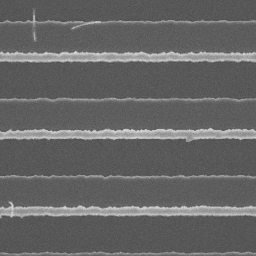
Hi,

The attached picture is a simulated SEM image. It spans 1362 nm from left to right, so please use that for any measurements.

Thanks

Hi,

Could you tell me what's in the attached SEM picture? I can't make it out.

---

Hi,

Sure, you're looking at lines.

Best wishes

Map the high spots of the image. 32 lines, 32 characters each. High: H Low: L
LLLLLLLLLLLLLLLLLLLLLLLLLLLLLLLL
LLLLLLLLLLLLLLLLLLLLLLLLLLLLLLLL
LLLLLLLLLLLLLLLLLLLLLLLLLLLLLLLL
HHHHHHHHHHHHHHHHHHHHHHHHHHHHHHHH
HHHHHHHHHHHHHHHHHHHHHHHHHHHHHHHH
HHHHHHHHHHHHHHHHHHHHHHHHHHHHHHHH
HHHHHHHHHHHHHHHHHHHHHHHHHHHHHHHH
HHHHHHHHHHHHHHHHHHHHHHHHHHHHHHHH
LLLLLLLLLLLLLLLLLLLLLLLLLLLLLLLL
LLLLLLLLLLLLLLLLLLLLLLLLLLLLLLLL
LLLLLLLLLLLLLLLLLLLLLLLLLLLLLLLL
LLLLLLLLLLLLLLLLLLLLLLLLLLLLLLLL
HHHHHHLHHHHHHHHHHHHHHHHHHHHHHHHH
HHHHHHHHHHHHHHHHHHHHHHHHHHHHHHHH
HHHHHHHHHHHHHHHHHHHHHHHHHHHHHHHH
HHHHHHHHHHHHHHHHHHHHHHHHHHHHHHHH
HHHHHHHHHHHHHHHHHHHHHHHHHHHHHHHH
LLLLLLLLLLLLLLLLLLLLLLLHLLLLLLLL
LLLLLLLLLLLLLLLLLLLLLLLLLLLLLLLL
LLLLLLLLLLLLLLLLLLLLLLLLLLLLLLLL
LLLLLLLLLLLLLLLLLLLLLLLLLLLLLLLL
LLLLLLLLLLLLLLLLLLLLLLLLLLLLLLLL
HHHHHHHHHHHHHHHHHHHHHHHHHHHHHHHH
HHHHHHHHHHHHHHHHHHHHHHHHHHHHHHHH
HHHHHHHHHHHHHHHHHHHHHHHHHHHHHHHH
HHHHHHHHHHHHHHHHHHHHHHHHHHHHHHHH
HHHHHHHHHHHHHHHHHHHHHHHHHHHHHHHH
LLLLLLLLLLLLLLLLLLLLLLLLLLLLLLLL
LLLLLLLLLLLLLLLLLLLLLLLLLLLLLLLL
LLLLLLLLLLLLLLLLLLLLLLLLLLLLLLLL
LLLLLLLLLLLLLLLLLLLLLLLLLLLLLLLL
LLLLLLLLLLLLLLLLLLLLLLLLLLLLLLLL